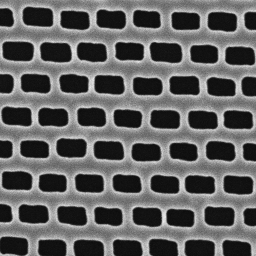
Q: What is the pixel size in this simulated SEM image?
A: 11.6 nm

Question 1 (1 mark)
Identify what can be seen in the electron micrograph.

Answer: a regular array of holes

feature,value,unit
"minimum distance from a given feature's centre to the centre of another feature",0.422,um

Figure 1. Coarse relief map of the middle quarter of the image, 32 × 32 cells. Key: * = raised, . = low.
********************************
********************************
...*****************************
......**.......***......***.....
......*........**.......**......
......**.......**........*......
......**.......**........*......
*********......***......***.....
********************************
********************************
********************************
.**.......***.....*****....*****
.**.......**.......***.......**.
.**........*........**.......**.
.**........*.......**........**.
****......***......***.......***
********************************
********************************
********************************
......**......******************
......*........**.......**......
......*........**.......**......
......**.......**.......**......
**.*****.......**.......***.....
******************..***********.
********************************
********************************
****....************************
.**.......**.......***......**..
.**.......**.......***.......*..
.**.......**.......***.......*..
***.......***......***.......*..